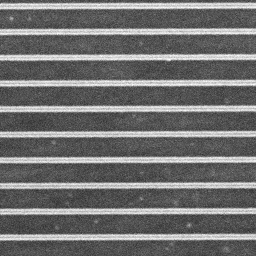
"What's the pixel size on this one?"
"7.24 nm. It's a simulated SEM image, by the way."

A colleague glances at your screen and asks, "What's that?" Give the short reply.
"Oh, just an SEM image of parallel lines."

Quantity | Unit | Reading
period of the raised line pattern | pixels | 25.7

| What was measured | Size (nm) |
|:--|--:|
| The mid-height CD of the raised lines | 27.2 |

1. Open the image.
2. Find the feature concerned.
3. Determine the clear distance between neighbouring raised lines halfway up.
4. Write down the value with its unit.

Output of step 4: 159 nm